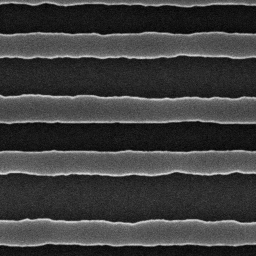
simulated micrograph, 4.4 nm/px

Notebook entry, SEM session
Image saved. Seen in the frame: lines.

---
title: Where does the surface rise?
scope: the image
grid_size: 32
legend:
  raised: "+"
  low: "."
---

+..++..++++..+++++++++++++++++++
................................
................................
................................
++++++++++++++++++++++++++++++++
++++++++++++++++++++++++++++++++
++++++++++++++++++++++++++++++++
................................
................................
................................
................................
................................
++++++++++++++++++++++++++++++++
++++++++++++++++++++++++++++++++
++++++++++++++++++++++++++++++++
................................
................................
................................
................................
++++++++++++++++++++++++++++++++
++++++++++++++++++++++++++++++++
++++++++++++++++++++++++++++++++
................................
................................
................................
................................
................................
...++++............++..++.......
++++++++++++++++++++++++++++++++
++++++++++++++++++++++++++++++++
++++++++++++++++++++++++++++++++
................................